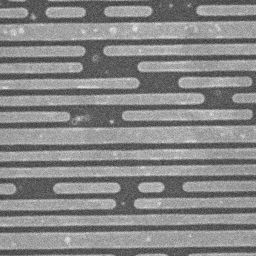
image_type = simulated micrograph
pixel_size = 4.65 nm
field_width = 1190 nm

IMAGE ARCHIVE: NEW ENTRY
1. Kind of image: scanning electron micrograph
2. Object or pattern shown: groups of lines, slits or small figures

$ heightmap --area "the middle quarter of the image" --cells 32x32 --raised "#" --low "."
####...............#############
####...............#######..####
................................
..............................##
###################..........###
##################...........###
................................
.........................#######
################################
################################
................................
..............................##
#..............#################
#..............#################
................................
................................
################################
################################
################################
##############........####......
................................
................................
################################
################################
................................
................................
################################
################################
................................
................................
##############.....######.....##
##############.....######.....##